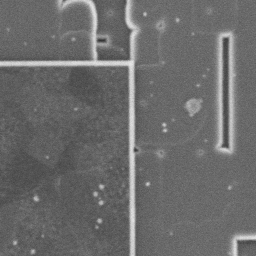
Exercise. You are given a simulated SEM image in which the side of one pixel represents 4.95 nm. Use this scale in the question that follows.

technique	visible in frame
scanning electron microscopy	wiring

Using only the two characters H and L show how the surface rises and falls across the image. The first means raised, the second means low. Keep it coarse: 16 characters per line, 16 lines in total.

LLLLLLLLLLLLLLLL
LLLLLLLLLLLLLLLL
LLLLLLLLLLLLLLLL
LLLLLLLLLLLLLLLL
HHHHHHHHLLLLLLLL
HHHHHHHHLLLLLLLL
HHHHHHHHLLLLLLLL
HHHHHHHHLLLLLLLL
HHHHHHHHLLLLLLLL
HHHHHHHHLLLLLLLL
HHHHHHHHLLLLLLLL
HHHHHHHHLLLLLLLL
HHHHHHHHLLLLLLLL
HHHHHHHHLLLLLLLL
HHHHHHHHLLLLLLLL
HHHHHHHHLLLLLLLL